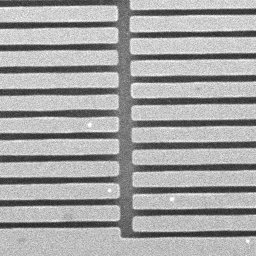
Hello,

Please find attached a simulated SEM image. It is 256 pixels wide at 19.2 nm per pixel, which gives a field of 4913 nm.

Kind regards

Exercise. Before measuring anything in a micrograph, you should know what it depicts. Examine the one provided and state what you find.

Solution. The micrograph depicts groups of lines, slits or small figures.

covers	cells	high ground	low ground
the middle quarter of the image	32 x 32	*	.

.................***************
.................***************
*************....***************
*************...................
*************...................
*************....***************
.................***************
.................***************
*************...................
*************...................
*************.....**************
.................***************
.................***************
*......******....***************
*************...................
*************...................
*************....***************
.................***************
.................***************
*************.....*.............
*************...................
*************.........**********
*******..........***************
.................***************
*************....***************
*************...................
*************...................
*************....***************
.................***************
.................***************
**************....**************
**************..................